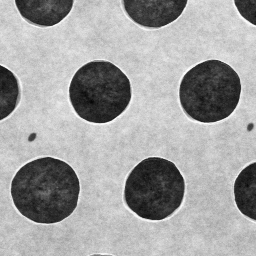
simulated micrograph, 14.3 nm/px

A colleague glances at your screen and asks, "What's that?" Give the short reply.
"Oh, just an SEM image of holes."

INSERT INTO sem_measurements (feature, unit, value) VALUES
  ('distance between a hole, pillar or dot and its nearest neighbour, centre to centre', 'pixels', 109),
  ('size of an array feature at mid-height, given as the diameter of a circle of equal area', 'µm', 0.891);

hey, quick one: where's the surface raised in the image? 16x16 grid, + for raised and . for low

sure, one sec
+...++++....+++.
++.++++++..+++++
++++++++++++++++
++++++++++++++++
.++++...++++...+
.+++....+++....+
.+++....+++....+
+++++..+++++..++
++++++++++++++++
++++++++++++++++
+...++++...++++.
+....+++....+++.
+....+++...++++.
++..+++++..++++.
++++++++++++++++
++++++++++++++++